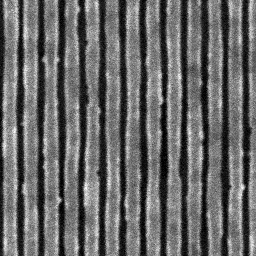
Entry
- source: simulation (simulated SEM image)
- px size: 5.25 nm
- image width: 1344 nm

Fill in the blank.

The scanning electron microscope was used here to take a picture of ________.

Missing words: parallel lines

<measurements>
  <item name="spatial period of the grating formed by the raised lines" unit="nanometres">107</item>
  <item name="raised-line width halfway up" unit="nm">65.6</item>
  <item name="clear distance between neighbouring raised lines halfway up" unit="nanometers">43.9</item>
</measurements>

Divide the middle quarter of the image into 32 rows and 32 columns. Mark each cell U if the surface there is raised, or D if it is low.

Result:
DUUDDDUUUDDUUUDDUUUDDUUUDDUUUDDU
DUUDDDUUUDDUUUDDUUUDDUUUDDUUUDDU
DUUUDDUUUDDUUUDDUUUDDUUUDDUUUDDU
DUUUDDUUDDDUUUDDUUUDDUUUDDUUUDDU
DUUUDDUUDDDUUUDDUUUDDUUUDDUUUDDU
DUUUDDUUDDDUUUDDUUUDDUUUDDUUUDDU
DUUUDDUUDDDUUUDDUUUDDUUUDDUUUDDU
DUUUDDUUDDDUUUDDUUUDDUUUDDUUUDDU
DUUUDDUUDDDUUUDDUUUDDUUUUDUUUDDU
DUUDDDUUDDDUUUDDUUUDDUUUUDUUUDDU
DUUDDDUUUDDUUUDDUUUDDUUUDDUUUDDU
DUUDDDUUUDDUUUDDUUUDDUUUDDUUUDDU
DUUDDDUUUDDUUUDDUUUDDUUUDDUUUDDU
DUUDDDUUUDDUUUDDUUUDDUUUDDUUUDDU
DUUDDDUUUDDUUUDDUUUDDUUUDDUUUDDU
DUUDDDUUUDDUUUDDUUUDDUUUDDUUUDDU
DUUUDDUUUDDUUUDDUUUDDUUUDDUUUDDU
DUUUDDUUUDDUUUDDUUUDDUUUDDUUUDDU
DUUUDDUUUDDUUUDDUUUDDUUUDDUUUDDU
DUUUDDUUUDDUUUDDUUUDDUUUDDUUUDDU
DUUDDDUUUDDUUUDUUUUDDUUUDDUUUDDU
DUUDDDUUUDDUUUDDUUUDDUUUDDUUUDDU
DUUDDUUUUDDUUUDDUUUDDUUUDDUUUDDU
DUUDDUUUUDDUUUDDUUUDDUUUDDUUUDDU
UUUDDUUUUDDUUUDDUUUDDUUUDDUUDDDU
UUUDDUUUUDDUUUDDUUUDDUUUDDUUDDDU
UUUDDUUUUDDUUUDDUUUDDUUUDDUUDDDU
UUUDDDUUDDDUUUDDUUUDDUUUDDUUDDDU
UUUDDUUUUDDUUUDDUUUDDUUUDDUUUDDU
UUUDDUUUUDDUUUDDUUUDDUUUDDUUUDDU
UUUDDUUUUDDUUUDDUUUDDUUDDDUUUDDU
UUUDDUUUUDDUUUDDUUUDDUUDDDUUUDDU